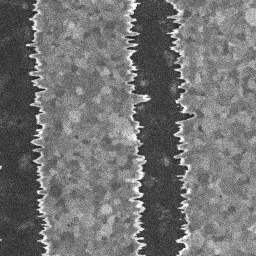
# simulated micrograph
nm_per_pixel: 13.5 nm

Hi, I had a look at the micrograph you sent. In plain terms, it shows one or a few lines or trenches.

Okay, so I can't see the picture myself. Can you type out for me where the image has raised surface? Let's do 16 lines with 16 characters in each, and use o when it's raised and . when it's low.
..oooooo...ooooo
..oooooo...ooooo
..oooooo...ooooo
..oooooo...ooooo
..oooooo...ooooo
..oooooo...ooooo
..ooooooo..ooooo
..oooooo....oooo
..ooooooo..ooooo
..ooooooo..ooooo
..ooooooo...oooo
...oooooo...oooo
...oooooo..ooooo
...oooooo...oooo
...oooooo...oooo
...oooooo..ooooo